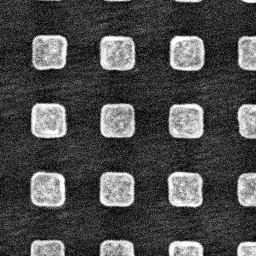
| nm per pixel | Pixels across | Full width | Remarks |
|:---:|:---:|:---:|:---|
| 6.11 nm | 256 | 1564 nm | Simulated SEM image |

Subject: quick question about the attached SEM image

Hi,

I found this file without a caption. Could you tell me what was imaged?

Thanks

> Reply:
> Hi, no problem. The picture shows a regular array of raised bodies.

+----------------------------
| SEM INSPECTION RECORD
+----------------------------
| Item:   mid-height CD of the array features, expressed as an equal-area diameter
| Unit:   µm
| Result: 0.221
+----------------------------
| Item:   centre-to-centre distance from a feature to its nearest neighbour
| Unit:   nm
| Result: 415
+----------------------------